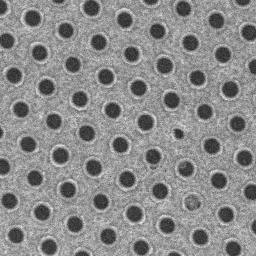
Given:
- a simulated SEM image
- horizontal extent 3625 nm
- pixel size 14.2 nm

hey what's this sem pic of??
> a regular array of holes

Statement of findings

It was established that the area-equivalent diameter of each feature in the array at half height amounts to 248 nanometers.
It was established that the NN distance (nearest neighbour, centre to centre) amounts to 483 nanometres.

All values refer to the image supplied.